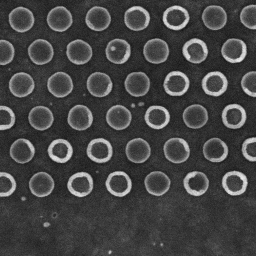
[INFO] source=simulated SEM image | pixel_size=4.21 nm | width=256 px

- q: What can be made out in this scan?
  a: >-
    a regular array of raised bodies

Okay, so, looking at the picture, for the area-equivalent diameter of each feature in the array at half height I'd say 103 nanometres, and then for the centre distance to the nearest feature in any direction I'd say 160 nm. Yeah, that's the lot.